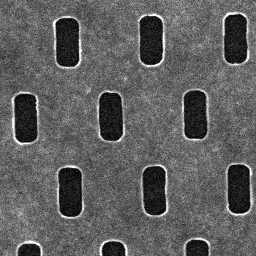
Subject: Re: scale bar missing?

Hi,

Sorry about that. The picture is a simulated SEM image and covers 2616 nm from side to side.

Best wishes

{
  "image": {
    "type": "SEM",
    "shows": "a regular array of holes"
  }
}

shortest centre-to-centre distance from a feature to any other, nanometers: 862